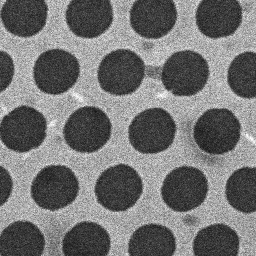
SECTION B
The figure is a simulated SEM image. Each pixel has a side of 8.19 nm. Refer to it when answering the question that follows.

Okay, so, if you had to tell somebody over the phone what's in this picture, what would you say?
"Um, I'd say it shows a regular array of holes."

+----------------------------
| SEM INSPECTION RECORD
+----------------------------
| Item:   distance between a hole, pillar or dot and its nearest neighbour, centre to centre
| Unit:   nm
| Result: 531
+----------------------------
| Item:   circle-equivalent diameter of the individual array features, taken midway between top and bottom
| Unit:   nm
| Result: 391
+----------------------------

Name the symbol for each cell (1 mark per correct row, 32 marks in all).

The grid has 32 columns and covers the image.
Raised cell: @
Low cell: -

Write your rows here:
------@@@-----@@@-----@@@-----@@
------@@------@@------@@------@@
------@@------@@------@@------@@
@----@@@@-----@@------@@@-----@@
@@--@@@@@@--@@@@@@--@@@@@@---@@@
@@@@@@@@@@@@@@@@@@@@@@@@@@@@@@@@
-@@@@@---@@@@@---@@@@@--@@@@@@@-
--@@@-----@@@-----@@@-----@@@---
--@@------@@------@@------@@@---
--@@------@@------@@------@@----
-@@@-----@@@------@@------@@@---
@@@@@---@@@@@----@@@@----@@@@---
@@@@@@@@@@@@@@@@@@@@@@@@@@@@@@@@
@@--@@@@@@--@@@@@@@-@@@@@@@@@@@@
@----@@@@----@@@@----@@@@----@@@
------@@------@@------@@------@@
------@@------@@------@@------@@
-----@@@------@@------@@------@@
@---@@@@@----@@@@----@@@@----@@@
@@@@@@@@@@@@@@@@@@@@@@@@@@@@@@@@
@@@@@@@@@@@@@@@@@@@@@@@@@@@@@@@@
-@@@@----@@@@----@@@@----@@@@---
--@@------@@------@@@-----@@----
--@@------@@------@@------@@----
-@@@------@@------@@------@@----
@@@@-----@@@-----@@@@----@@@@---
@@@@@@@@@@@@@@-@@@@@@@@@@@@@@@--
@@@@@@@@@@@@@@@@@@@@@@@@@@@@@@@@
@----@@@@----@@@@----@@@@----@@@
-----@@@------@@------@@------@@
------@@------@@------@@------@@
-----@@@------@@------@@------@@